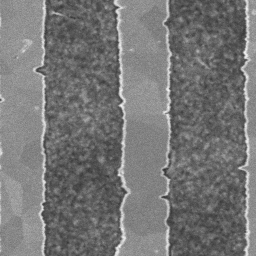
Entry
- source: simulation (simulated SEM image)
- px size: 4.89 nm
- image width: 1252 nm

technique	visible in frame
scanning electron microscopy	one or a few lines or trenches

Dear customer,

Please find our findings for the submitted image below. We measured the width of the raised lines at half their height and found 0.231 µm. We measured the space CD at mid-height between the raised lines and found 374 nanometers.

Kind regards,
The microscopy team